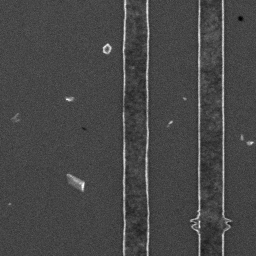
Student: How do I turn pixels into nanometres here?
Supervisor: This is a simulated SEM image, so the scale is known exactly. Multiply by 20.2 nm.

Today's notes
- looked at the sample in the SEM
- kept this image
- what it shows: one or a few lines or trenches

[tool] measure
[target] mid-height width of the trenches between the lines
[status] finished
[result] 1050 nm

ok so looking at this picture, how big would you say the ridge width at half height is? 484 nm